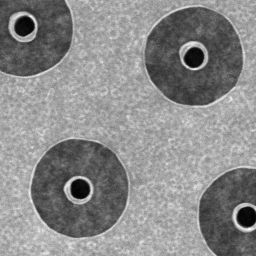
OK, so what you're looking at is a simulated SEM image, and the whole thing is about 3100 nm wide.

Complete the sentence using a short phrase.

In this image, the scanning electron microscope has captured ring-shaped grooves with a dot in the middle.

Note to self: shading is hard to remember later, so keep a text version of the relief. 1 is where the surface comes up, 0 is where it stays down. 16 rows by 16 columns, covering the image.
0000111111110111
0000011111000011
0000011110000001
0000111110000001
0001111110000001
1111111111000001
1111111111100111
1111111111111111
1111111111111111
1110000111111111
1100000011111110
1100000011111000
1100000011111000
1100000011110000
1111000111111000
1111111111111000